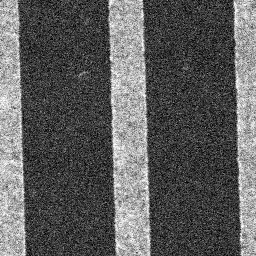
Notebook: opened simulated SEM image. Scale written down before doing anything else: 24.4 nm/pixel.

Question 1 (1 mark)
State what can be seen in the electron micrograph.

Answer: one or a few lines or trenches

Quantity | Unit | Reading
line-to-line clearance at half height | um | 2.23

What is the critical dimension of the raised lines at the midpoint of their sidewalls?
807 nm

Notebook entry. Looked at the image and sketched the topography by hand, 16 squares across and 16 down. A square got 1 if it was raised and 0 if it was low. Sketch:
1000000110000001
1000000110000001
1000000110000001
1000000110000001
1000000110000001
1000000110000001
1000000110000001
1000000110000001
1000000110000001
1000000110000001
1000000110000001
1000000110000001
1000000110000001
1000000110000001
1100000110000001
1100000110000001